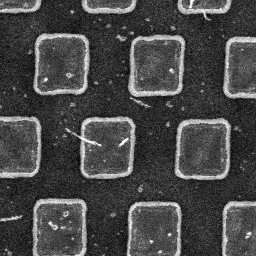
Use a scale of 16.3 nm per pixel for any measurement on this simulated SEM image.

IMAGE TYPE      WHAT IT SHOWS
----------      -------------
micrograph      raised bodies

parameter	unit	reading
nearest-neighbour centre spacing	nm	1550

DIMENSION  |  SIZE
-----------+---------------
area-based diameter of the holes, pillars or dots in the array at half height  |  976 nm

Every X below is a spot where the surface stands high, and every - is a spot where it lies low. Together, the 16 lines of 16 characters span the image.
XX----XX----XX--
----------------
---XX----XX----X
--XXX---XXX---XX
--XXX---XXX---XX
--XXX---XXX---XX
----------------
XX----XX--------
XX---XXX---XXX--
XX---XXX---XXX--
XX---XXX---XXX--
----------------
----------------
--XXX---XXX---XX
--XXX---XXX---XX
--XXX---XXX---XX